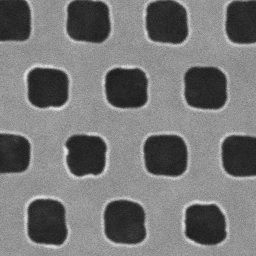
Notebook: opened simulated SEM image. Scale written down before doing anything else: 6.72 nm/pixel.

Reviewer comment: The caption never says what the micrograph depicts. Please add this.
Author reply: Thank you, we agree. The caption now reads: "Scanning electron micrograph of a regular array of holes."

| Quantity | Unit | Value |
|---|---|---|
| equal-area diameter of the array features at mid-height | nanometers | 309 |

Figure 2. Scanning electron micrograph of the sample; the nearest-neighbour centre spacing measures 0.524 µm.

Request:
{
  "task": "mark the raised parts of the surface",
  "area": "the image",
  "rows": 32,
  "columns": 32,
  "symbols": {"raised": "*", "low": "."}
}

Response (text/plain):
....*****....******....******...
....****......****.....*****....
....****......****.....*****....
....****......****......****....
....*****.....****.....*****....
******************************.*
********************************
********************************
****..********...*******...*****
***.....*****.....*****.....****
***......****......****.....****
***......****......****.....****
****....*****......****.....****
*****.*********..*******....****
********************************
********************************
********************************
...*****.....*****.....*****....
....****.....*****.....*****....
....****.....*****.....*****....
....****.....*****.....*****....
...******....******....*****....
********************************
********************************
********************************
****....*****....*******...*****
***.....*****.....*****.....****
***.....*****.....*****.....****
***.....*****.....*****.....****
***.....*****.....*****.....****
*****...*******..********..*****
********************************